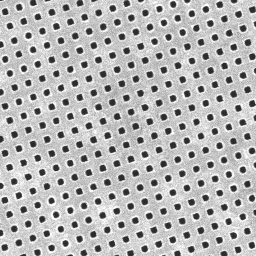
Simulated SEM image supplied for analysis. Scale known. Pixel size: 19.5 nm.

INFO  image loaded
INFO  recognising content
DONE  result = a regular array of holes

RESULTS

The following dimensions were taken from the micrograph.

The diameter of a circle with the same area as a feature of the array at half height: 139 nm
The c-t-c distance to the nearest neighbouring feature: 285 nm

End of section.